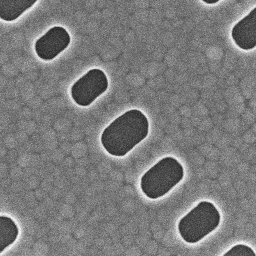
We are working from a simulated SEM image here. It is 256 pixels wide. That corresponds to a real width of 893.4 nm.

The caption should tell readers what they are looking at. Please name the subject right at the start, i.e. holes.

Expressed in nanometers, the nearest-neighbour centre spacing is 202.